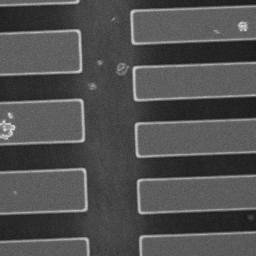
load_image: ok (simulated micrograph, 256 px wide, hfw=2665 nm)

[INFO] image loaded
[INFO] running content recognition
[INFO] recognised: groups of lines, slits or small figures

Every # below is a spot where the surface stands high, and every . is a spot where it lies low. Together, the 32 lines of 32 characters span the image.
#######.........................
.................###############
................################
................################
##########.......###############
##########.......##.............
##########......................
##########......................
##########.......###############
.................###############
.................###############
.................###############
................................
##########......................
##########......................
##########.......###############
##########.......###############
##########.......###############
.................###############
..................#.............
................................
..#########.....................
###########.......##############
###########......###############
###########......###############
###########......###############
######............###...........
................................
................................
..................##############
###########.......##############
###########.......##############